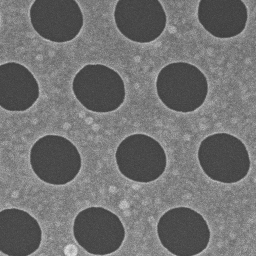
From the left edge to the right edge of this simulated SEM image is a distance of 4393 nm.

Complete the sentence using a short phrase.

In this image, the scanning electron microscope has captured holes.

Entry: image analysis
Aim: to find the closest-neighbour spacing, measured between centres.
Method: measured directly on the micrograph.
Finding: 1.42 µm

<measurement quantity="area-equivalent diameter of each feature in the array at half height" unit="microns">0.872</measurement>